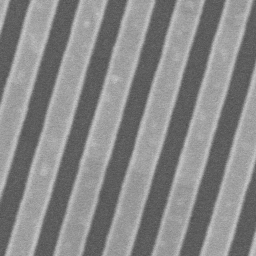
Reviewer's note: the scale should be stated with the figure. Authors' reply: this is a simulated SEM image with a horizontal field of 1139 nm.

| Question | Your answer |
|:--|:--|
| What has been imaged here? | parallel lines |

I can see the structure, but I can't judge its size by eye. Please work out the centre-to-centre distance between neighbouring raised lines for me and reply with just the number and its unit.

208 nm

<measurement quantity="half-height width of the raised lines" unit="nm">104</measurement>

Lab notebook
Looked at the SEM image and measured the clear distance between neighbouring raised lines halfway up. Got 0.104 microns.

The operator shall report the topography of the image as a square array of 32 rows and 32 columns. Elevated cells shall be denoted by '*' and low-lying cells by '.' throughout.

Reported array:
*...***...***...***...***...***.
*...***...***...***...***...***.
...***...***...***....***...***.
...***...***...***...***...***..
...***...***...***...***...***..
..***....***...***...***...***..
..***...***...***...***...****..
..***...***...***...***...***...
..***...***...***...***...***...
.***...***...****..****...***...
.***...***...***...***...***...*
.***...***...***...***...***...*
***...****...***...***...***...*
***...***...***...***....***...*
***...***...***...***...***...**
***...***...***...***...***...**
**...***...***....***...***...**
**...***...***...***...***...***
**...***...***...***...***...***
*...****..****...***...***...***
*...***...***...***...****...***
*...***...***...***...***...***.
*...***...***...***...***...***.
...***...***...***....***...***.
...***...***...***...***...***..
...***...***...***...***...***..
..***...****...***...***...***..
..***...***...***...***....***..
..***...***...***...***...***...
.****...***...***...***...***...
.***...***...***....***...***...
.***...***...***...***...***...*